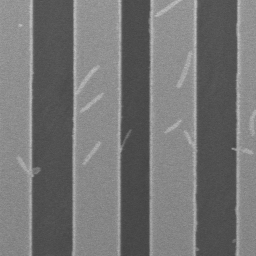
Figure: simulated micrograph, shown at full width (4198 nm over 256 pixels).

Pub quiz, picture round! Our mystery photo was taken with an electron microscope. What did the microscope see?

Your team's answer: lines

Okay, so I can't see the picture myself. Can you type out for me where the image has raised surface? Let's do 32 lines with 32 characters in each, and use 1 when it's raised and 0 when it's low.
11110000011111100001111100000011
11110000011111100001111100000011
11110000011111100001111100000011
11110000011111100001111100000011
11110000011111100001111100000011
11110000011111100001111100000011
11110000011111100001111100000011
11110000011111100001111100000011
11110000011111100001111100000011
11110000011111100001111100000011
11110000011111100001111100000011
11110000011111100001111100000011
11110000011111100001111100000011
11110000011111100001111100000011
11110000011111100001111100000011
11110000011111100001111100000011
11110000011111100001111100000011
11110000011111100001111100000011
11110000011111100001111100000111
11110000011111100001111100000011
11110000011111100001111100000011
11110000011111100001111100000011
11110000011111100001111100000011
11110000011111100001111100000011
11110000011111100001111100000011
11110000011111100001111100000011
11110000011111100001111100000011
11110000011111100001111100000011
11110000011111100001111100000011
11110000011111100001111100000011
11110000011111100001111100000011
11110000011111100001111100000011